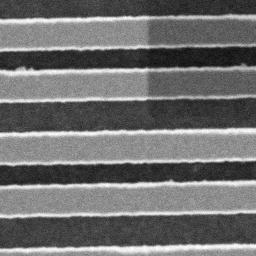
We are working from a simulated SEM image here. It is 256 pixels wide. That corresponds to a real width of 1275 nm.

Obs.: lines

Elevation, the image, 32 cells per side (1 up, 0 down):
00000000000000000000000000000000
00000000000000000000000000000000
11111111111111111111111111111111
11111111111111111111111111111111
11111111111111111111111111111111
11111111111111111111111111111111
00000000000000000000000000000000
00000000000000000000000000000000
00000000000000000000001111111111
11111111111111111111111111111111
11111111111111111111111111111111
11111111111111111111111111111111
11111111111000000000000000000000
00000000000000000000000000000000
00000000000000000000000000000000
00000000000000000000000000000000
00000000000011111111111111111111
11111111111111111111111111111111
11111111111111111111111111111111
11111111111111111111111111111111
11110100000000000000000000000000
00000000000000000000000000000000
00000000000000000000000000000000
11111111111111111111111111111111
11111111111111111111111111111111
11111111111111111111111111111111
11111111111111111111111111111111
00000000000000000000000000000000
00000000000000000000000000000000
00000000000000000000000000000000
00000000000000000000000000000000
11111111111111111111111111111111